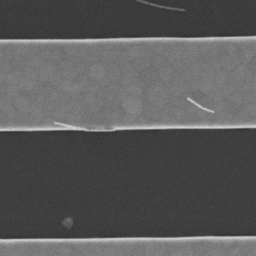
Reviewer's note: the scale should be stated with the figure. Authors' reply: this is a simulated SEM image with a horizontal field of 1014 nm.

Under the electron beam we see wiring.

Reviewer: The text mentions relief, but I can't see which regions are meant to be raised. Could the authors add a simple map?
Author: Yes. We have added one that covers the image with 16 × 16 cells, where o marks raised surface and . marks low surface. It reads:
................
................
.....ooooooooooo
oooooooooooooooo
oooooooooooooooo
oooooooooooooooo
oooooooooooooooo
oooooooooooooooo
................
................
................
................
................
................
................
oooooooooooooooo